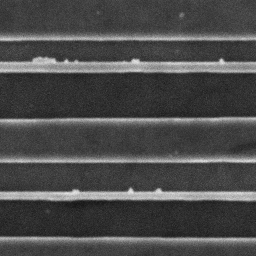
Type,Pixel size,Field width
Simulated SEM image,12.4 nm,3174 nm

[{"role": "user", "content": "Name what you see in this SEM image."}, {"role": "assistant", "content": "lines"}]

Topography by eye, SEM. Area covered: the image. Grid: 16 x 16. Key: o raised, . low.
oooooooooooooooo
oooooooooooooooo
oooooooooooooooo
oooooooooooooooo
................
................
................
oooooooooooooooo
oooooooooooooooo
oooooooooooooooo
oooooooooooooooo
oooooooooooooooo
................
................
................
oooooooooooooooo